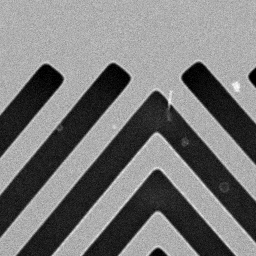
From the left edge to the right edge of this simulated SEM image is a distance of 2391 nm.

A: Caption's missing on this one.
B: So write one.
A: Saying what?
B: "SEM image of groups of lines, slits or small figures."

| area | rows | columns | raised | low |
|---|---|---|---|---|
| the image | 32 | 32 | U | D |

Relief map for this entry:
UUUUUUUUUUUUUUUUUUUUUUUUUUUUUUUU
UUUUUUUUUUUUUUUUUUUUUUUUUUUUUUUU
UUUUUUUUUUUUUUUUUUUUUUUUUUUUUUUU
UUUUUUUUUUUUUUUUUUUUUUUUUUUUUUUU
UUUUUUUUUUUUUUUUUUUUUUUUUUUUUUUU
UUUUUUUUUUUUUUUUUUUUUUUUUUUUUUUU
UUUUUUUUUUUUUUUUUUUUUUUUUUUUUUUU
UUUUUUUUUUUUUUUUUUUUUUUUUUUUUUUU
UUUUUDDUUUUUUDDUUUUUUUUUDDUUUUUU
UUUUDDDDUUUUDDDDUUUUUUUDDDDUUUUD
UUUDDDDDUUUDDDDDUUUUUUUDDDDDUUUU
UUDDDDDUUUUDDDDUUUUDUUUUDDDDUUUU
UUDDDDUUUUDDDDUUUUDDDUUUUDDDDUUU
UDDDDUUUUDDDDDUUUDDDDDUUUUDDDDUU
DDDDUUUUDDDDDUUUDDDDDDDUUUUDDDDU
DDDDUUUDDDDDUUUUDDDDDDDDUUUDDDDD
DDDUUUUDDDDUUUUDDDDDDDDDUUUUDDDD
DDUUUUDDDDUUUUDDDDDUUDDDDUUUUDDD
DUUUUDDDDUUUUDDDDDUUUUDDDDUUUUDD
UUUUDDDDDUUUDDDDDUUUUUDDDDDUUUUD
UUUDDDDDUUUDDDDDUUUUUUUDDDDDUUUU
UUDDDDDUUUUDDDDUUUUDUUUUDDDDDUUU
UDDDDDUUUUDDDDUUUUDDDUUUUDDDDDUU
UDDDDUUUUDDDDDUUUDDDDDUUUUDDDDDU
DDDDUUUUDDDDDUUUDDDDDDDUUUUDDDDU
DDDDUUUDDDDDUUUUDDDDDDDDUUUUDDDD
DDDUUUUDDDDUUUUDDDDDDDDDDUUUDDDD
DDUUUUDDDDUUUUDDDDUUUDDDDDUUUDDD
DUUUUDDDDUUUUDDDDDUUUUDDDDUUUUDD
UUUUDDDDDUUUDDDDDUUUUUUDDDDUUUUD
UUUDDDDDUUUDDDDDUUUUUUUUDDDDUUUU
UUDDDDDUUUUDDDDUUUUDDUUUDDDDDUUU